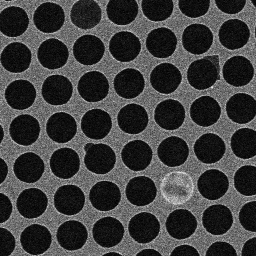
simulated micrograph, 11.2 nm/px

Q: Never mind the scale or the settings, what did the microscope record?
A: a regular array of holes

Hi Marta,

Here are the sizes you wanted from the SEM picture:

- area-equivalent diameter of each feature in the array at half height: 350 nm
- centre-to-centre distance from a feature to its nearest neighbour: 403 nanometres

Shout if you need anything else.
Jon